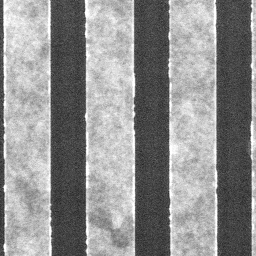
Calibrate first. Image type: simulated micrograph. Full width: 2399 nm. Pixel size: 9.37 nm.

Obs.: lines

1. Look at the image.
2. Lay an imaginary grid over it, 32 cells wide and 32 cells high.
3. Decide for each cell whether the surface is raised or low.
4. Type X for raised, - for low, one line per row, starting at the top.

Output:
-XXXXX-----XXXXXX----XXXXXX-----
-XXXXX-----XXXXXX----XXXXXX-----
-XXXXX-----XXXXXX----XXXXXX----X
-XXXXX-----XXXXXX----XXXXXX----X
-XXXXX-----XXXXXX----XXXXXX-----
-XXXXX-----XXXXXX----XXXXXX-----
-XXXXX-----XXXXXX----XXXXXX-----
-XXXXX-----XXXXXX----XXXXXX-----
-XXXXX-----XXXXXX----XXXXXX-----
-XXXXX-----XXXXXX----XXXXXX-----
-XXXXX-----XXXXXX----XXXXXX-----
-XXXXX-----XXXXXX----XXXXXX-----
-XXXXX-----XXXXXX----XXXXXX-----
-XXXXX-----XXXXXX----XXXXXX-----
-XXXXX-----XXXXXX----XXXXXX-----
-XXXXX-----XXXXXX----XXXXXX----X
-XXXXX-----XXXXXX----XXXXXX----X
-XXXXX-----XXXXXX----XXXXXX-----
-XXXXX-----XXXXXX----XXXXXX-----
-XXXXX-----XXXXXX----XXXXXX----X
-XXXXX-----XXXXXX----XXXXXX-----
-XXXXX-----XXXXXX----XXXXXX-----
-XXXXX-----XXXXXX----XXXXXX-----
-XXXXX-----XXXXXX----XXXXXX-----
-XXXXX-----XXXXXX----XXXXXX-----
-XXXXX-----XXXXXX----XXXXXX-----
-XXXXX-----XXXXXX----XXXXXX-----
-XXXXX-----XXXXXX----XXXXXX-----
-XXXXX-----XXXXXX----XXXXXX-----
-XXXXX-----XXXXXX----XXXXXX-----
-XXXXX-----XXXXXX----XXXXXX-----
-XXXXX-----XXXXXX----XXXXXX-----